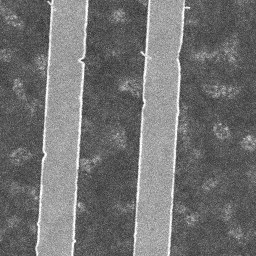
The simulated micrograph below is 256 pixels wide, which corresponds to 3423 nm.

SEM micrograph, one or a few lines or trenches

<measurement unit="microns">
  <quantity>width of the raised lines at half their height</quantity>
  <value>0.474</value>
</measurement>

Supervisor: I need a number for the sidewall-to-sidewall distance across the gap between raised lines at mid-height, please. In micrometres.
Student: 0.811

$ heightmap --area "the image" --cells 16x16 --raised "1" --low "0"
0001100001100000
0001100001100000
0001100001100000
0001100001100000
0001100001100000
0001100001100000
0001100001100000
0001100001100000
0001100001100000
0001100001100000
0001100001100000
0001100001100000
0001100001100000
0011100011100000
0011100011100000
0011100011100000